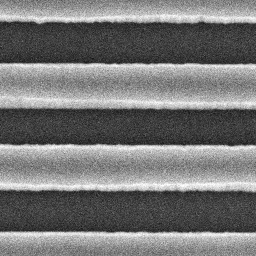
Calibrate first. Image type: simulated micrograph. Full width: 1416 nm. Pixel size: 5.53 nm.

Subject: lines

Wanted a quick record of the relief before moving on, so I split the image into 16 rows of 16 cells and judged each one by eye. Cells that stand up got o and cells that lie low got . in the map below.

oooooooooooooooo
................
................
................
oooooooooooooooo
oooooooooooooooo
..oooooooooooooo
................
................
oooooooooooooooo
oooooooooooooooo
oooooooooooooooo
................
................
................
oooooooooooooooo